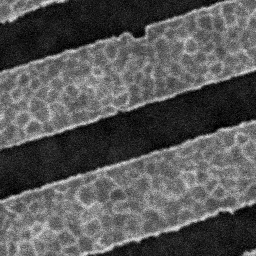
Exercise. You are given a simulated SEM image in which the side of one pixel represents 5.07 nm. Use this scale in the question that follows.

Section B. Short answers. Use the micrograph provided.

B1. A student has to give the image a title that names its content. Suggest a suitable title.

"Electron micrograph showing one or a few lines or trenches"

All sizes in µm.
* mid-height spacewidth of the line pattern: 0.252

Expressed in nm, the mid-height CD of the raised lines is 370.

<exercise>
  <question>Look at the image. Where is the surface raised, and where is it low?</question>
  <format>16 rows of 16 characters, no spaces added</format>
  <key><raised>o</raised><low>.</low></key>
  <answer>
oo...........ooo
..........oooooo
.......ooooooooo
....oooooooooooo
ooooooooooooooo.
oooooooooooo....
ooooooooo.......
oooooo..........
ooo..........ooo
..........oooooo
.......ooooooooo
...ooooooooooooo
oooooooooooooooo
ooooooooooooo...
oooooooooo......
ooooooo.........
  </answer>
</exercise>